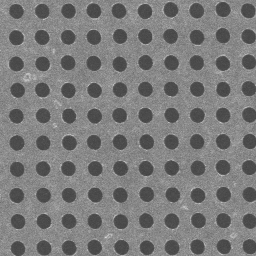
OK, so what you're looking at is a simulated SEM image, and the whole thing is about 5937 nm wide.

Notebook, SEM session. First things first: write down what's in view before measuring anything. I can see a regular array of holes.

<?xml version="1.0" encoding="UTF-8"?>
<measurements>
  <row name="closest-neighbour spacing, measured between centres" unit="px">25.5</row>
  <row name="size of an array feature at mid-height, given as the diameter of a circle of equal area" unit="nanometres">342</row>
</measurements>